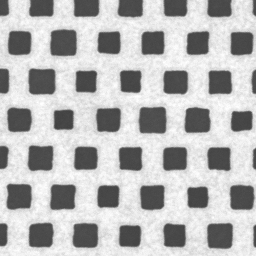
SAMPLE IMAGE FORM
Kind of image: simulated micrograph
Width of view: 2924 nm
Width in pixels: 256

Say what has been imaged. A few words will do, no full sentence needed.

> a regular array of holes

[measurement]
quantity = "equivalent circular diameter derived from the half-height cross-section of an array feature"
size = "298 nanometers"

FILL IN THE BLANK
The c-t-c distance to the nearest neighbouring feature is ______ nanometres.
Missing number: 499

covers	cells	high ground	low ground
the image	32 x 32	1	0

01110001100011100011000111000111
01110001100011100011100111000111
11111111111111111111111111111111
11111111111111111111111111111111
10001100001100011100011100111000
10001100001100011100011000111000
10001100001110011100111000111001
11111111111111111111111111111111
11111111111111111111111111111111
01110001100011100011000111000111
01110001100011100011000111000110
01110001110011110111100111000111
11111111111111111111111111111111
10011111111110011100111101111111
10001110011100011000011000111000
10001110011100011000011000111000
11011111111111111100011000111111
11111111111111111111111111111111
01110011110011100111100111001111
01100001100011100011000111000111
01100001100011100011000111000111
11111111111111111111111111111111
11111111111111111111111111111111
10001100011100011100111100111000
10001100011100011100011000111000
10001100011100011100011100111000
11111111111111111111111111111111
11111111111111111111111111111111
01110001100011100011100111000111
01110001100011100011100111000111
01110001100011100011100111000111
11111111111111111111111111111111